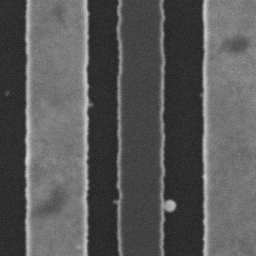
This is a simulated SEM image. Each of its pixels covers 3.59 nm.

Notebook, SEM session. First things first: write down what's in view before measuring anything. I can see lines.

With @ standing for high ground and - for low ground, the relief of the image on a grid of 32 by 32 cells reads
---@@@@@@@@----@@@@@-----@@@@@@@
---@@@@@@@@----@@@@@-----@@@@@@@
---@@@@@@@@----@@@@@-----@@@@@@@
---@@@@@@@@----@@@@@------@@@@@@
---@@@@@@@@----@@@@@------@@@@@@
---@@@@@@@@----@@@@@-----@@@@@@@
---@@@@@@@@----@@@@@------@@@@@@
---@@@@@@@@----@@@@@@----@@@@@@@
---@@@@@@@@----@@@@@@----@@@@@@@
---@@@@@@@@----@@@@@-----@@@@@@@
---@@@@@@@@----@@@@@-----@@@@@@@
---@@@@@@@@----@@@@@------@@@@@@
---@@@@@@@@----@@@@@-----@@@@@@@
---@@@@@@@@----@@@@@-----@@@@@@@
---@@@@@@@@----@@@@@-----@@@@@@@
---@@@@@@@@----@@@@@------@@@@@@
---@@@@@@@@----@@@@@------@@@@@@
---@@@@@@@@----@@@@@@----@@@@@@@
---@@@@@@@@----@@@@@-----@@@@@@@
---@@@@@@@@----@@@@@-----@@@@@@@
---@@@@@@@@----@@@@@------@@@@@@
---@@@@@@@@----@@@@@@-----@@@@@@
---@@@@@@@@----@@@@@-----@@@@@@@
---@@@@@@@@----@@@@@------@@@@@@
---@@@@@@@@----@@@@@------@@@@@@
---@@@@@@@@----@@@@@-----@@@@@@@
---@@@@@@@@----@@@@@------@@@@@@
---@@@@@@@@----@@@@@------@@@@@@
---@@@@@@@@----@@@@@------@@@@@@
---@@@@@@@@----@@@@@------@@@@@@
---@@@@@@@@----@@@@@------@@@@@@
---@@@@@@@@----@@@@@------@@@@@@